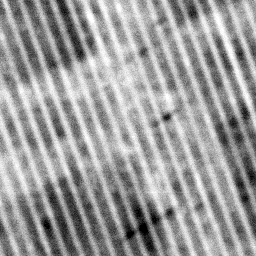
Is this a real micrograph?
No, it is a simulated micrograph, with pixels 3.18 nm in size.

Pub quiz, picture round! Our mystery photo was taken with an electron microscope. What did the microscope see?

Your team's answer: parallel lines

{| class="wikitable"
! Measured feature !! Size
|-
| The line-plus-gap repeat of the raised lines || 47.7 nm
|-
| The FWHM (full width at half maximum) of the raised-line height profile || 15.3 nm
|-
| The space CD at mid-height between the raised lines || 33.5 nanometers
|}